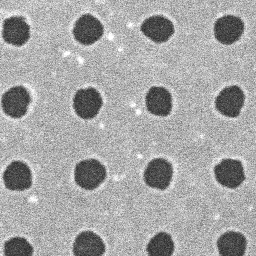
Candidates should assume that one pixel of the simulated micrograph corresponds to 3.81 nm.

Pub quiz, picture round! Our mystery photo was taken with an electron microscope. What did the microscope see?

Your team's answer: a regular array of holes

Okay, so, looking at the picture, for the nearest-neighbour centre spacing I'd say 70.9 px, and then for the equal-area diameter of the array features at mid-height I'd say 120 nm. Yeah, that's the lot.